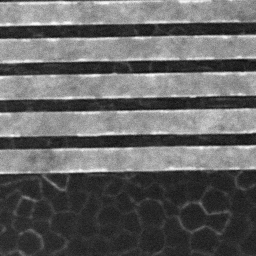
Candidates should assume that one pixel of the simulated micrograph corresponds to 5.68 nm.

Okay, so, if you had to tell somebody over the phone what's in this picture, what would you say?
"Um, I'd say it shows parallel lines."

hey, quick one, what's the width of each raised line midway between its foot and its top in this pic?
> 0.135 microns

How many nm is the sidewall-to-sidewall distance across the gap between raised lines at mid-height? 74.5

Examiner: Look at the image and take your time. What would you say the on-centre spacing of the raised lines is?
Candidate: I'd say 0.209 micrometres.